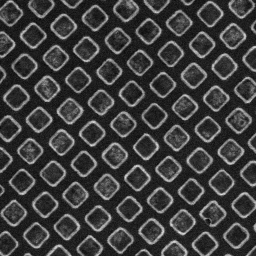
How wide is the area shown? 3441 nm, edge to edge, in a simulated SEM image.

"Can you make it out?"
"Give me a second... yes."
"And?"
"a regular array of raised bodies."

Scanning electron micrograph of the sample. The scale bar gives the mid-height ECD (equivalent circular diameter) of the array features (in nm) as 294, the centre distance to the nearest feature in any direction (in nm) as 422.